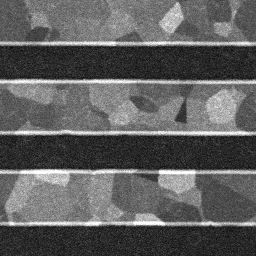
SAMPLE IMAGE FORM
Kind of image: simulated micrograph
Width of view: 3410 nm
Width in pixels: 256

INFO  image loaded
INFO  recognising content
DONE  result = one or a few lines or trenches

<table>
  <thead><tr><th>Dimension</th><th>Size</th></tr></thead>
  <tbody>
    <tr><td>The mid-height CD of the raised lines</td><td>673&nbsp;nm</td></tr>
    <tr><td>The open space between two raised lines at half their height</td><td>39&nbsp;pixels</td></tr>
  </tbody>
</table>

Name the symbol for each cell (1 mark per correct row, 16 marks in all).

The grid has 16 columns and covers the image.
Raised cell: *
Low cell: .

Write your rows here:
****************
****************
****************
................
................
****************
****************
****************
................
................
................
****************
****************
****************
................
................